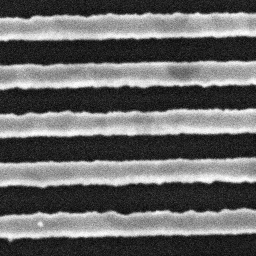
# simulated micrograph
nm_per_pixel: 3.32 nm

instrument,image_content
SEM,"lines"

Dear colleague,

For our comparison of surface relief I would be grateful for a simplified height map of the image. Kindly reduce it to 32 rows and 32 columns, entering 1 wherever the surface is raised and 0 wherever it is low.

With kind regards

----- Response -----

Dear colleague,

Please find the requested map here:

00000000000000000000000000000000
00000000000000000000000000000000
11111111111111111111111111111111
11111111111111111111111111111111
11111111111111111111111111010000
00000000000000000000000000000000
00000000000000000000000000000000
00000000000000000000000000000000
11111111111111111111111111111111
11111111111111111111111111111111
11111111111111101110111111110000
00000000000000000000000000000000
00000000000000000000000000000000
00000000000000000000000000000000
11111111111111111111111111111111
11111111111111111111111111111111
11111111111111101001000001001000
00000000000000000000000000000000
00000000000000000000000000000000
00000000000000000000000000000000
11111111111111111111111111111111
11111111111111111111111111111111
11111111111111111111111101111111
00000000000000000000000000000000
00000000000000000000000000000000
00000000000000000000000000000000
00000000000000000000100100001111
11111111111111111111111111111111
11111111111111111111111111111111
11111100011000000000000000000000
00000000000000000000000000000000
00000000000000000000000000000000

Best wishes